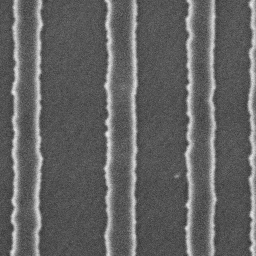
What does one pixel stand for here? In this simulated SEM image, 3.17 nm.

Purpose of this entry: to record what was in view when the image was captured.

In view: lines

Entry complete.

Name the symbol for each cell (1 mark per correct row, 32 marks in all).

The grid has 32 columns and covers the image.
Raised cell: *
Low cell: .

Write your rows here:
..***........****.......***....*
..***........****.......***....*
..***........****......****....*
..***........****......****.....
..***........****.......***.....
..***........****......****.....
..***.........***.......***....*
..***.........***.......***....*
..***.........***.......***....*
..***........****.......***....*
..***........****.......***....*
..***........****.......***....*
..***........****......****....*
..***........****.......***....*
..***.........***.......***....*
..***........****.......***....*
..***........****.......***....*
..***........****.......***....*
..***........****.......***.....
..***........****......****....*
..***........****......****....*
..***........****......****.....
..***........****.......***....*
..***........****.......***....*
..***........****.......***....*
..***........****......****.....
..***........****.......***....*
.****........****......****.....
..***........****......****....*
..***........****......****....*
..***........****......****.....
.****........****......****....*